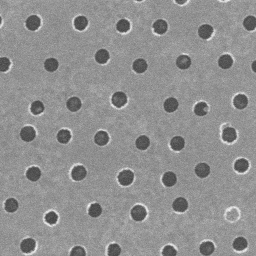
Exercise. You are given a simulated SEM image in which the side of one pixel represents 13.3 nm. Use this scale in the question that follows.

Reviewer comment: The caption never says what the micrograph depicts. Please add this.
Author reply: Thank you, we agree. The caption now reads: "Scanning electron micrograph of a regular array of holes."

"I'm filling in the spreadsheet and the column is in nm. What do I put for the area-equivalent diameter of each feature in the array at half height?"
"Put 208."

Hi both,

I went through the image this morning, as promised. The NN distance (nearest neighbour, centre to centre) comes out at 486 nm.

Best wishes